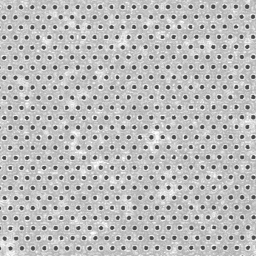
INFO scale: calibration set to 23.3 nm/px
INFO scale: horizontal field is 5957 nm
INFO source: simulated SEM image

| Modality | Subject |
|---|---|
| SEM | a regular array of holes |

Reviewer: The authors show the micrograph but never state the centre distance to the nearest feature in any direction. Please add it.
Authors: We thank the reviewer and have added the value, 259 nm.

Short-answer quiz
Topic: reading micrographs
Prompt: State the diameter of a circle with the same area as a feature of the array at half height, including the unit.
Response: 102 nm